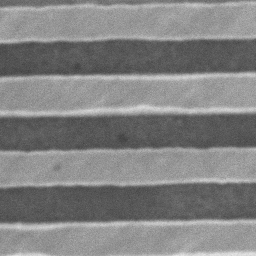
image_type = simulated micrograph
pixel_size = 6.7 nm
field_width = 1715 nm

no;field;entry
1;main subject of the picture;lines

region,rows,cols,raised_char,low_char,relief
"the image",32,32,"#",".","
.......................#....####
################################
################################
################################
################################
................................
................................
................................
................................
.....#...#######################
################################
################################
################################
################################
................................
................................
................................
................................
............................#...
################################
################################
################################
################################
................................
................................
................................
................................
................................
################################
################################
################################
################################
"